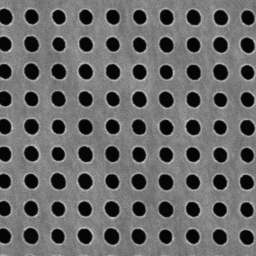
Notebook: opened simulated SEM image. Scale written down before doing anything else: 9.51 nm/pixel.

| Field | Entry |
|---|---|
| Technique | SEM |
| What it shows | a regular array of holes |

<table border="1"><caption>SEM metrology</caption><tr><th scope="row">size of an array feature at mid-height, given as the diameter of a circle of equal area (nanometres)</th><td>141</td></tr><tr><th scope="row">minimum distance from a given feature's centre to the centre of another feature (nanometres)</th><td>256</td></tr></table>